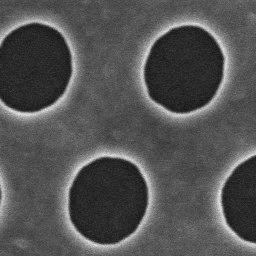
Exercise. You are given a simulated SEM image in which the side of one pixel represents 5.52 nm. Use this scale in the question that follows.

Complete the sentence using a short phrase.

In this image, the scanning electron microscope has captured holes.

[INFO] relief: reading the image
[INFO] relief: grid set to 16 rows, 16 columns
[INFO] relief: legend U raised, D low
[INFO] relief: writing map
UUUUUUUUUUUUUUUU
UUDUUUUUUUUUUUUU
DDDDUUUUUUDDDUUU
DDDDUUUUUDDDDDUU
DDDDDUUUUDDDDDUU
DDDDUUUUUDDDDDUU
DDDUUUUUUUDDDUUU
UUUUUUUUUUUUUUUU
UUUUUUUUUUUUUUUU
UUUUUUUUUUUUUUUU
UUUUUDDDDUUUUUUD
UUUUDDDDDUUUUUDD
UUUUDDDDDUUUUUDD
UUUUDDDDDUUUUUDD
UUUUUDDDUUUUUUUD
UUUUUUUUUUUUUUUU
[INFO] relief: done